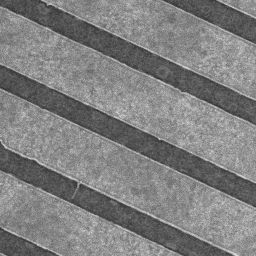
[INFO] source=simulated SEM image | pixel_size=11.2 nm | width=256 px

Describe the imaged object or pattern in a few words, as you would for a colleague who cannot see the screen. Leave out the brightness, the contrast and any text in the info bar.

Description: one or a few lines or trenches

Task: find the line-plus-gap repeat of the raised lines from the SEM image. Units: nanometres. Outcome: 831